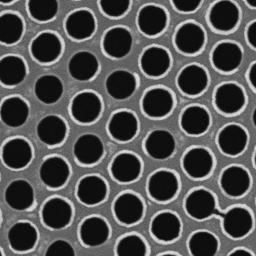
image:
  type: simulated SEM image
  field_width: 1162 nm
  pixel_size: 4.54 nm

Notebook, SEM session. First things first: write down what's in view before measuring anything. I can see a regular array of holes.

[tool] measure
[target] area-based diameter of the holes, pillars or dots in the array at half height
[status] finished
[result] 128 nm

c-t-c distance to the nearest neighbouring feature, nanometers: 187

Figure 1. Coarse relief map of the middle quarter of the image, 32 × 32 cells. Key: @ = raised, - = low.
@-------@@@@@@@@@@@-------@@@@@@
@-------@@@@@@@@@@@@------@@@@--
@@------@@@@-----@@@@---@@@@@---
@@@----@@@@------@@@@@@@@@@@@---
@@@@@@@@@@@-------@@@@@@@@@@@---
@@@@@@@@@@@-------@@@@@@@@@@@---
@@@@@@@@@@@-------@@@@---@@@@@--
@@@@---@@@@@-----@@@@-----@@@@@@
@@@-----@@@@@---@@@@-------@@@@@
@@-------@@@@@@@@@@@-------@@@@@
@@-------@@@@@@@@@@@-------@@@@@
@@-------@@@@@@@@@@@------@@@@@-
@@-------@@@@----@@@@----@@@@@--
@@@-----@@@@------@@@@@@@@@@@---
@@@@--@@@@@@------@@@@@@@@@@@---
@@@@@@@@@@@-------@@@@@@@@@@@@--
@@@@@@@@@@@-------@@@@@@@@@@@@--
@@@@@@@@@@@@------@@@@----@@@@@@
@@@@----@@@@@----@@@@------@@@@@
@@@------@@@@@@@@@@@@-------@@@@
@@@-------@@@@@@@@@@@-------@@@@
@@@-------@@@@@@@@@@@------@@@@@
@@@------@@@@@@-@@@@@------@@@@-
@@@------@@@@-----@@@@@--@@@@@--
@@@@@--@@@@@-------@@@@@@@@@@@--
-@@@@@@@@@@@-------@@@@@@@@@@@--
-@@@@@@@@@@@-------@@@@@@@@@@@--
-@@@@@@@@@@@-------@@@@----@@@@-
-@@@@----@@@@-----@@@@------@@@@
@@@@------@@@@@@@@@@@-------@@@@
@@@@------@@@@@@@@@@@-------@@@@
@@@@------@@@@@@@@@@@-------@@@@